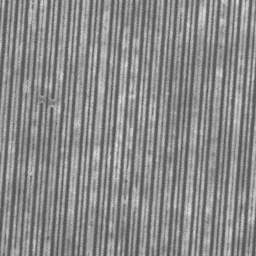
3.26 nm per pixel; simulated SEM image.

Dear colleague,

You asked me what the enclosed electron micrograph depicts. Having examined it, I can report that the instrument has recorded parallel lines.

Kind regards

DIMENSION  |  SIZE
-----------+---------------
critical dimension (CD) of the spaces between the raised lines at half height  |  11.8 nm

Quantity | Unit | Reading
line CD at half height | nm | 8.9